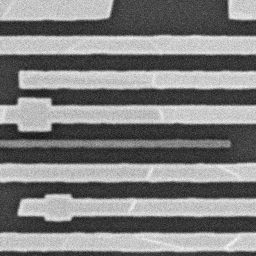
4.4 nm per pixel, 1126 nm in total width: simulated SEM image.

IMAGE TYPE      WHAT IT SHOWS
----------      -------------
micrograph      wiring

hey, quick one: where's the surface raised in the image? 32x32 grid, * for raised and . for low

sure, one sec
**************...............***
**************...............***
................................
................................
................................
********************************
********************************
................................
................................
..******************************
..******************************
................................
..****..........................
********************************
********************************
..*****.........................
................................
................................
................................
................................
..............................**
********************************
********************************
................................
......***.......................
...*****************************
..******************************
......***.......................
................................
********************************
********************************
................................